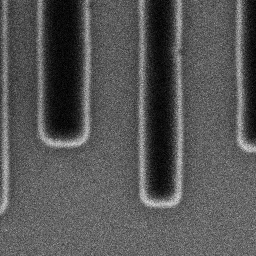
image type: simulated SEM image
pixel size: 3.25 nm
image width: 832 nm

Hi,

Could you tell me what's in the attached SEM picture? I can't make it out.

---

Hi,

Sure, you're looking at one or a few lines or trenches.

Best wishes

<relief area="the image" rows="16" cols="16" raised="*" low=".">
..***....**....*
..***....**....*
..****...**....*
..****...**....*
..****...**....*
..***....**....*
..***....**....*
...**....**....*
...**....**....*
.........**.....
.........**.....
.........**.....
.........**.....
................
................
................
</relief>